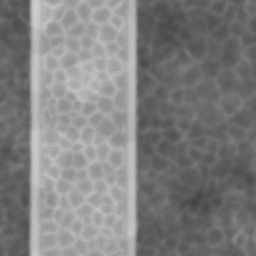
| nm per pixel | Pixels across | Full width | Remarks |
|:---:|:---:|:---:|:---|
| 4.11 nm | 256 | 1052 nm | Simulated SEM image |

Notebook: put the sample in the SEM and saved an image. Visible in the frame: one or a few lines or trenches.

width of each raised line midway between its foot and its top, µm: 0.396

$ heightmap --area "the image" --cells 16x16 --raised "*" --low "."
..******........
..******........
..******........
..******........
..******........
..******........
..******........
..******........
..******........
..******........
..******........
..******........
..******........
..******........
..******........
..******........